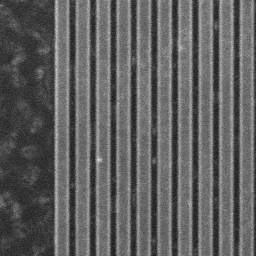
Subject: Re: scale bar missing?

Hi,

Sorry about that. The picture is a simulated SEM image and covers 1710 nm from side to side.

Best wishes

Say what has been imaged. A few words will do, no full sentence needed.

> parallel lines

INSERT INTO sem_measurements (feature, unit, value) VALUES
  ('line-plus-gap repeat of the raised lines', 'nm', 137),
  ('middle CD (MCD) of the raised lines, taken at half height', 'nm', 82.7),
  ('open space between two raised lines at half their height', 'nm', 57.6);